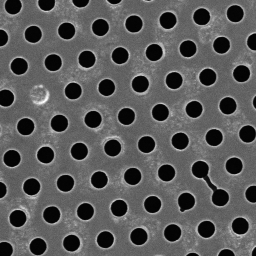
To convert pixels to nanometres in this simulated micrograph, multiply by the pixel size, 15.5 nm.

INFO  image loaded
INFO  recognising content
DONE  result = a regular array of holes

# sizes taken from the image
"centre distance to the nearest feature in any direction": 524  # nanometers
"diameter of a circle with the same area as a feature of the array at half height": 264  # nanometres